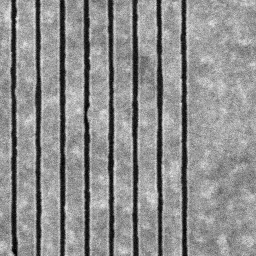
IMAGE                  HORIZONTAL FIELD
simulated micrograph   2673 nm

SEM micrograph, parallel lines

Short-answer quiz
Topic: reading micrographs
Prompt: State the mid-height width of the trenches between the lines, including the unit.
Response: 73.1 nm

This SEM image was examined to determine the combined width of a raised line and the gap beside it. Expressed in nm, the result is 254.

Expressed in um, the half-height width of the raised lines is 0.188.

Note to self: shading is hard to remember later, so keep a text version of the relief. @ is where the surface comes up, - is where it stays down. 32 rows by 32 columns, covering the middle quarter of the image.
-@@@@--@@@@--@@@@--@@@@--@@@@--@
-@@@@--@@@@--@@@@--@@@@--@@@@--@
-@@@@--@@@@--@@@@--@@@@--@@@@--@
-@@@@--@@@@--@@@@--@@@@--@@@@--@
-@@@@--@@@@--@@@@--@@@@--@@@@--@
-@@@@--@@@@--@@@@--@@@@--@@@@--@
-@@@@--@@@@--@@@@--@@@@--@@@@--@
-@@@@--@@@@--@@@@--@@@@--@@@@--@
-@@@@--@@@@--@@@@--@@@@--@@@@--@
-@@@@--@@@@--@@@@--@@@@--@@@@--@
-@@@@-@@@@@--@@@@--@@@@--@@@@--@
-@@@@-@@@@@--@@@@--@@@@--@@@@--@
-@@@@-@@@@@--@@@@--@@@@--@@@@--@
-@@@@-@@@@@--@@@@--@@@@--@@@@--@
-@@@@-@@@@@--@@@@--@@@@--@@@@--@
-@@@@--@@@@--@@@@--@@@@--@@@@--@
-@@@@--@@@@--@@@@--@@@@--@@@@--@
-@@@@--@@@@--@@@@--@@@@--@@@@--@
-@@@@--@@@@--@@@@--@@@@--@@@@--@
-@@@@--@@@@--@@@@--@@@@--@@@@--@
@@@@@--@@@@--@@@@--@@@@--@@@@--@
@@@@@--@@@@--@@@@--@@@@--@@@@--@
-@@@@--@@@@--@@@@--@@@@--@@@@--@
-@@@@--@@@@--@@@@--@@@@--@@@@--@
-@@@@--@@@@--@@@@--@@@@--@@@@--@
-@@@@--@@@@--@@@@--@@@@--@@-@--@
-@@@@--@@@@--@@@@--@@@@--@@@@--@
-@@@@--@@@@--@@@@--@@@@--@@@@--@
-@@@@--@@@@--@@@@--@@@@--@@@@--@
-@@@@--@@@@--@@@@--@@@@--@@@@--@
-@@@@--@@@@--@@@@--@@@@--@@@@--@
-@@@@--@@@@--@@@@--@@@@--@@@@--@